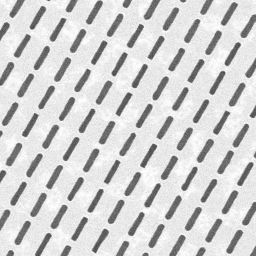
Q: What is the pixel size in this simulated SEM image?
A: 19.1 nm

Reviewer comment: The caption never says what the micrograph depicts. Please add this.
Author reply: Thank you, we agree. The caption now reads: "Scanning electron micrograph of a regular array of holes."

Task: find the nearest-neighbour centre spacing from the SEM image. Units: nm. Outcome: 442